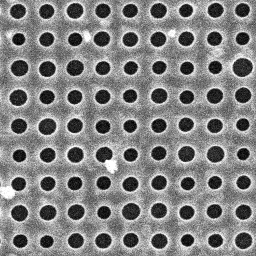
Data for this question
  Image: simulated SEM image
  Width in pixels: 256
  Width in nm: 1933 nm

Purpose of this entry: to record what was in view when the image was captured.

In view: a regular array of holes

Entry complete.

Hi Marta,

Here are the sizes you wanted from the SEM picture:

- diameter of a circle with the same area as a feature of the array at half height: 117 nm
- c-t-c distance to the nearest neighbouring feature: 208 nm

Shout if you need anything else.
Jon